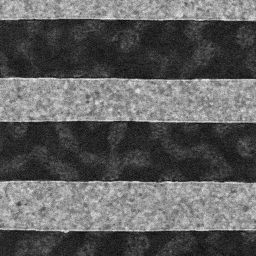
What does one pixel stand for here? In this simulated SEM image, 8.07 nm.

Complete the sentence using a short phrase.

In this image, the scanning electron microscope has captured one or a few lines or trenches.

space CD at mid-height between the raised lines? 487 nanometres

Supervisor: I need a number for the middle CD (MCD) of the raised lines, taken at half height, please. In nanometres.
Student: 364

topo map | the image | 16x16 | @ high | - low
@@@@@@@@@@@@@@@@
----------------
----------------
----------------
----------------
@@@@@@@@@@@@@@@@
@@@@@@@@@@@@@@@@
@@@@@@@@@@@@@@@@
----------------
----------------
----------------
@@@@@@@@@@@@@@@@
@@@@@@@@@@@@@@@@
@@@@@@@@@@@@@@@@
----------------
----------------